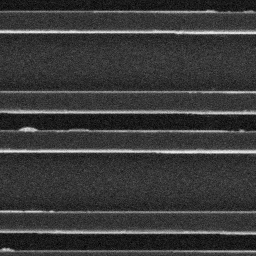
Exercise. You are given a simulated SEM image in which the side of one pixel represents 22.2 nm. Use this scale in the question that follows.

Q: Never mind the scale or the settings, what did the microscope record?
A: lines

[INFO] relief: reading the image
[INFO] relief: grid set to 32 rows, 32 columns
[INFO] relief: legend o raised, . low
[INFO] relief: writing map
................................
ooooooooooooooooooooooooooo.....
oooooooooooooooooooooooooooooooo
oooooooooooooooooooooooooooooooo
................................
................................
................................
................................
................................
................................
................................
................................
oooooooooooooooooooooooooooooooo
oooooooooooooooooooooooooooooooo
................................
................................
oooooooooooooooooooooooooooooooo
oooooooooooooooooooooooooooooooo
oooooooooooooooooooooooooooooooo
................................
................................
................................
................................
................................
................................
................................
ooooooo.........................
oooooooooooooooooooooooooooooooo
oooooooooooooooooooooooooooooooo
................................
................................
oooooooooooooooooooooooooooooooo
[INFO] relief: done